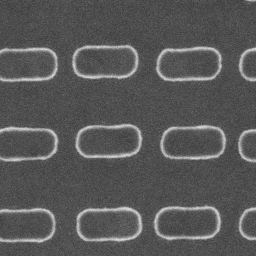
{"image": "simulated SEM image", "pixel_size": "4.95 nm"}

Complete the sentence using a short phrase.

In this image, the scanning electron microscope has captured raised bodies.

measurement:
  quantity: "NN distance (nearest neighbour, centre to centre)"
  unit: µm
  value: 0.389